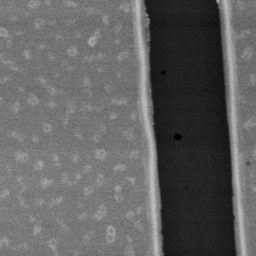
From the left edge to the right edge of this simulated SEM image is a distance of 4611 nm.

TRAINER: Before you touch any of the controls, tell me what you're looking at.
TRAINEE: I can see one or a few lines or trenches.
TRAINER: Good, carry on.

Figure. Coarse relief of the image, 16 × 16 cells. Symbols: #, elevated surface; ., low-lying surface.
#########.....##
#########.....##
#########.....##
#########.....##
#########.....##
#########......#
#########......#
#########......#
#########......#
#########......#
#########......#
##########.....#
##########.....#
##########.....#
##########.....#
##########.....#